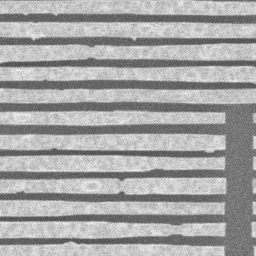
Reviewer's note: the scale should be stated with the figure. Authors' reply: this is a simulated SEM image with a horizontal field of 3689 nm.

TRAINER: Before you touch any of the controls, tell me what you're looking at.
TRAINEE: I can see parallel lines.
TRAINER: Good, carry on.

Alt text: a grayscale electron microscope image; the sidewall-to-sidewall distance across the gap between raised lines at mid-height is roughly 122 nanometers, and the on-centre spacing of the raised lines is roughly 320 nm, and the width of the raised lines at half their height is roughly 198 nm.